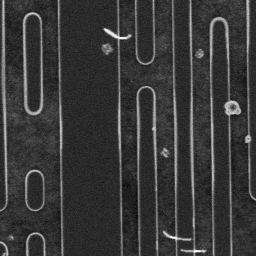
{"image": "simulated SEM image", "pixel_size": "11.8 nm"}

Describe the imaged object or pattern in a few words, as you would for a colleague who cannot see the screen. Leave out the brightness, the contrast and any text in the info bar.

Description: groups of lines, slits or small figures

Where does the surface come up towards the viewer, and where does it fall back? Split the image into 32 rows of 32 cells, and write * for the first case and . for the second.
.......********..**...**.......*
.......********..**...**.......*
...**..********..**...**...*...*
...**..********..**...**..**...*
...**..********..**...**..**...*
...**..********..**...**..**...*
...**..********..**...**..**...*
...**..********..**...**..***..*
...**..********.......**..***..*
...**..********.......**..***..*
...**..********.......**..***..*
...**..********..**...**..***..*
...**...*******..**...**..***..*
...**...*******..**...**..****.*
........*******..**...**..***..*
*.......*******..**...**..***..*
*.......*******..**...**...**..*
*.......*******..**...**...**..*
*.......*******..**...**...**..*
*.......*******..**...**...**..*
*.......*******..**...**...**..*
*...*...*******..***..**...**..*
*..**...*******..***..**...**..*
*..**...*******..***..**...**..*
*..**...*******..***..**...**..*
*..**...*******..***..**...**...
........*******..***..**...**...
........*******..***..**...**...
........*******..***..**...**...
....*...*******..***..**...**...
...***..*******..***..**...**...
*..***..*******..***..**...**...